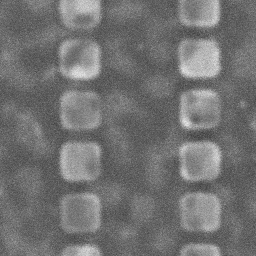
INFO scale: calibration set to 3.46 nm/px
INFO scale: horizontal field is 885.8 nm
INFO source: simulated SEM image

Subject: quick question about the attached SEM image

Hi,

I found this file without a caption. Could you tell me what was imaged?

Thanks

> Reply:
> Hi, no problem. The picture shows a regular array of raised bodies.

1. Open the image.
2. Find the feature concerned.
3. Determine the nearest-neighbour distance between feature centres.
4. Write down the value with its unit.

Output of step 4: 0.177 microns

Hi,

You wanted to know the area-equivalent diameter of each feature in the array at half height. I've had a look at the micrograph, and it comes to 0.14 µm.